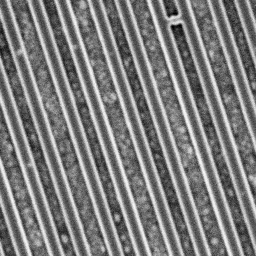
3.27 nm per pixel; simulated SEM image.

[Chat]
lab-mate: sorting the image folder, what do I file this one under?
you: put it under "parallel lines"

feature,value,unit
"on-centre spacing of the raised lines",28.5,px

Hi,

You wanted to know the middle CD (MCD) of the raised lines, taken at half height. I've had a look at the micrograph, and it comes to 13.1 pixels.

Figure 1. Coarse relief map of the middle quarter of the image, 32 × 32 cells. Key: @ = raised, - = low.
---@@@-----@@@@---@@@-----@@@@--
---@@@@-----@@@---@@@@-----@@@--
----@@@-----@@@----@@@-----@@@--
@---@@@-----@@@@---@@@-----@@@@-
@---@@@@-----@@@---@@@@-----@@@-
@----@@@-----@@@----@@@-----@@@-
@@---@@@-----@@@@---@@@-----@@@@
@@---@@@@-----@@@---@@@@-----@@@
@@----@@@-----@@@----@@@-----@@@
@@@---@@@-----@@@@---@@@-----@@@
@@@---@@@@-----@@@---@@@@----@@@
@@@----@@@-----@@@---@@@@-----@@
@@@----@@@-----@@@@---@@@-----@@
-@@@---@@@@----@@@@---@@@@----@@
-@@@---@@@@-----@@@---@@@@-----@
-@@@@---@@@-----@@@@---@@@-----@
-@@@@---@@@@----@@@@---@@@@----@
--@@@---@@@@-----@@@---@@@@-----
--@@@----@@@-----@@@@---@@@-----
--@@@@---@@@@----@@@@---@@@-----
---@@@---@@@@-----@@@---@@@@----
---@@@----@@@-----@@@----@@@----
---@@@@---@@@-----@@@@---@@@----
----@@@---@@@@-----@@@---@@@@---
----@@@----@@@-----@@@----@@@---
----@@@@---@@@-----@@@@---@@@---
-----@@@---@@@@-----@@@---@@@@--
-----@@@----@@@-----@@@----@@@--
-----@@@@---@@@-----@@@@---@@@--
@-----@@@---@@@@-----@@@---@@@@-
@-----@@@----@@@-----@@@----@@@-
@-----@@@@---@@@-----@@@@---@@@-